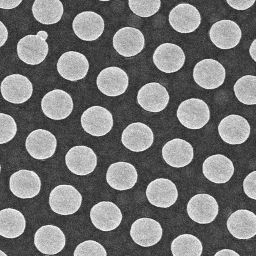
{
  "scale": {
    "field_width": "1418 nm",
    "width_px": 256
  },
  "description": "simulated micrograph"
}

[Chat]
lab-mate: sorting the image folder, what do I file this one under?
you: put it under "a regular array of raised bodies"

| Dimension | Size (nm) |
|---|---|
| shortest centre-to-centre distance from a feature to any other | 236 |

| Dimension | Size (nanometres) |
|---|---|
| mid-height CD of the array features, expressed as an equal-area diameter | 167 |